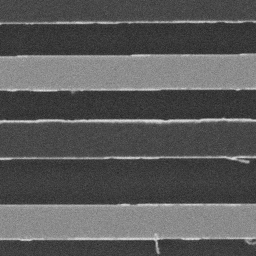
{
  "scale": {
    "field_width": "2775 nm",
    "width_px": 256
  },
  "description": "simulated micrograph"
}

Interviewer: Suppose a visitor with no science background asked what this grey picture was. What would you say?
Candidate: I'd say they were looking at lines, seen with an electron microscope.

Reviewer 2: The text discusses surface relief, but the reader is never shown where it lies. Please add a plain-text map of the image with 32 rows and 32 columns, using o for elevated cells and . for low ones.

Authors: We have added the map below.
oooooooooooooooooooooooooooooooo
oooooooooooooooooooooooooooooooo
oooooooooooooooooooooooooooooooo
................................
................................
................................
................................
oooooooooooooooooooooooooooooooo
oooooooooooooooooooooooooooooooo
oooooooooooooooooooooooooooooooo
oooooooooooooooooooooooooooooooo
................................
................................
................................
................................
oooooooooooooooooooooooooooooooo
oooooooooooooooooooooooooooooooo
oooooooooooooooooooooooooooooooo
oooooooooooooooooooooooooooooooo
oooooooooooooooooooooooooooooooo
................................
................................
................................
................................
................................
................................
oooooooooooooooooooooooooooooooo
oooooooooooooooooooooooooooooooo
oooooooooooooooooooooooooooooooo
oooooooooooooooooooooooooooooooo
................................
................................